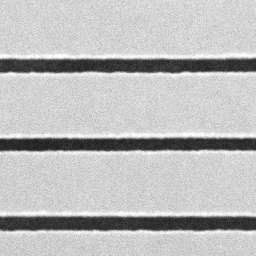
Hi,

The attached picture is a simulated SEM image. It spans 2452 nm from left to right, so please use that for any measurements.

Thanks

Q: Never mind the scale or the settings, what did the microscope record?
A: lines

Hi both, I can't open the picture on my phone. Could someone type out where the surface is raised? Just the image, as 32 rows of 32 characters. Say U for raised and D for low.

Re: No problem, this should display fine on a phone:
UUUUUUUUUUUUUUUUUUUUUUUUUUUUUUUU
UUUUUUUUUUUUUUUUUUUUUUUUUUUUUUUU
UUUUUUUUUUUUUUUUUUUUUUUUUUUUUUUU
UUUUUUUUUUUUUUUUUUUUUUUUUUUUUUUU
UUUUUUUUUUUUUUUUUUUUUUUUUUUUUUUU
UUUUUUUUUUUUUUUUUUUUUUUUUUUUUUUU
UUUUUUUUUUUUUUUUUUUUUUUUUUUUUUUU
DDDDDDDDDDDDDDDDDDDDDDDDDDDDDDDD
DDDDDDDDDDDDDDDDDDDDDDDDDDDDDDDD
UUUUUUUUUUUUUUUUUUUUUUUUUUUUUUUU
UUUUUUUUUUUUUUUUUUUUUUUUUUUUUUUU
UUUUUUUUUUUUUUUUUUUUUUUUUUUUUUUU
UUUUUUUUUUUUUUUUUUUUUUUUUUUUUUUU
UUUUUUUUUUUUUUUUUUUUUUUUUUUUUUUU
UUUUUUUUUUUUUUUUUUUUUUUUUUUUUUUU
UUUUUUUUUUUUUUUUUUUUUUUUUUUUUUUU
UUUUUUUUUUUUUUUUUUUUUUUUUUUUUUUU
DDDDDDDDDDDDDDDDDDDDDDDDDDDDDDDD
DDDDDDDDDDDDDDDDDDDDDDDDDDDDDDDD
UUUUUUUUUUUUUUUUUUUUUUUUUUUUUUUU
UUUUUUUUUUUUUUUUUUUUUUUUUUUUUUUU
UUUUUUUUUUUUUUUUUUUUUUUUUUUUUUUU
UUUUUUUUUUUUUUUUUUUUUUUUUUUUUUUU
UUUUUUUUUUUUUUUUUUUUUUUUUUUUUUUU
UUUUUUUUUUUUUUUUUUUUUUUUUUUUUUUU
UUUUUUUUUUUUUUUUUUUUUUUUUUUUUUUU
UUUUUUUUUUUUUUUUUUUUUUUUUUUUUUUU
DDDDDDDDDDDDDDDDDDDDDDDDDDDDDDDD
DDDDDDDDDDDDDDDDDDDDDDDDDDDDDDDD
UUUUUUUUUUUUUUUUUUUUUUUUUUUUUUUU
UUUUUUUUUUUUUUUUUUUUUUUUUUUUUUUU
UUUUUUUUUUUUUUUUUUUUUUUUUUUUUUUU